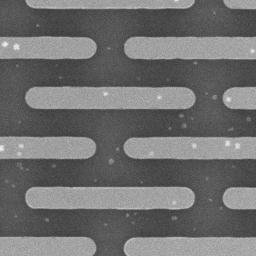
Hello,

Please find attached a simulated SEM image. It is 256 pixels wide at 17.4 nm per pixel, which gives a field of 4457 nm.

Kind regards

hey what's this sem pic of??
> groups of lines, slits or small figures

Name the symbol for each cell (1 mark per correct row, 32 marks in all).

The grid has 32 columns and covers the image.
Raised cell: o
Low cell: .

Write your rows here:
...ooooooooooooooooooooo....oooo
................................
................................
................................
................................
oooooooooooo....oooooooooooooooo
oooooooooooo....oooooooooooooooo
................................
................................
................................
................................
...ooooooooooooooooooooo....oooo
...ooooooooooooooooooooo....oooo
.....oooooooooooooooooo......ooo
................................
................................
................................
ooooooooooo.....oooooooooooooooo
oooooooooooo...ooooooooooooooooo
ooooooooooo.....oooooooooooooooo
................................
................................
................................
....ooooooooooooooooooo......oo.
...ooooooooooooooooooooo....oooo
....oooooooooooooooooooo....oooo
................................
................................
................................
................................
oooooooooooo....oooooooooooooooo
oooooooooooo....oooooooooooooooo